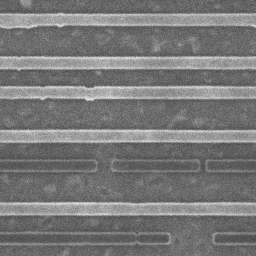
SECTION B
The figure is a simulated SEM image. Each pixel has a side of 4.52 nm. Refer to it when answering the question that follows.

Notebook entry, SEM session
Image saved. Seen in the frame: parallel lines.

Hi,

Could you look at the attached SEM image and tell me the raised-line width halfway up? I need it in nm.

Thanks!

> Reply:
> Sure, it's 51.5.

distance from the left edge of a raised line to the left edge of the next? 166 nanometers